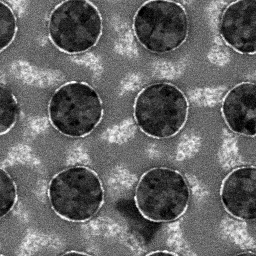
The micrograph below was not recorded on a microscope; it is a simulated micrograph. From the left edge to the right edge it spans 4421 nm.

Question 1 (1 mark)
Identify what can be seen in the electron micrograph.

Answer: raised bodies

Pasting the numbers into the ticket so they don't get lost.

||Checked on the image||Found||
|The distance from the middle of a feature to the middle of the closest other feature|1460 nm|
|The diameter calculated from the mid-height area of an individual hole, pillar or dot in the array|0.936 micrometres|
